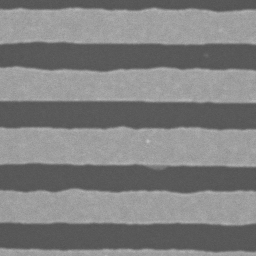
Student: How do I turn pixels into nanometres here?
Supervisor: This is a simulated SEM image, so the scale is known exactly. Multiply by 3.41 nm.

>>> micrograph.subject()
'lines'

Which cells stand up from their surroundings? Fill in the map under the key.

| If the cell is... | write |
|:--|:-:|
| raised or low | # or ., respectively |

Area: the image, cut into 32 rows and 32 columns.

................................
###########################.####
################################
################################
################################
.......................#........
................................
................................
####...............###..........
################################
################################
################################
################################
................................
................................
................................
################################
################################
################################
################################
#........#######################
................................
................................
................................
################################
################################
################################
################################
................................
................................
................................
##########################..###.